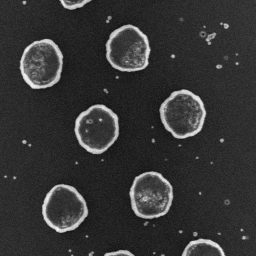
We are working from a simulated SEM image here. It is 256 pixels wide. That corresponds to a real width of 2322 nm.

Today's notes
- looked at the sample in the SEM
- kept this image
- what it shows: raised bodies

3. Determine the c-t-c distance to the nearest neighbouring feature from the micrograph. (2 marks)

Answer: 774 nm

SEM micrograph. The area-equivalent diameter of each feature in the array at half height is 391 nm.